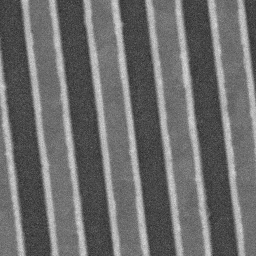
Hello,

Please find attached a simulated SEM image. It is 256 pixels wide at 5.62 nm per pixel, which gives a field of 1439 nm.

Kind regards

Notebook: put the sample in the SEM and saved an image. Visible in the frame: parallel lines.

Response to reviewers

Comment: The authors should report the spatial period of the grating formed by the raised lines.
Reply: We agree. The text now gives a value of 348 nm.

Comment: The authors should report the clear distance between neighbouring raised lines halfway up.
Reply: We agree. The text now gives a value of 186 nanometres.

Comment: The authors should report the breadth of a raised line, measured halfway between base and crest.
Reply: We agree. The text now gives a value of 161 nanometers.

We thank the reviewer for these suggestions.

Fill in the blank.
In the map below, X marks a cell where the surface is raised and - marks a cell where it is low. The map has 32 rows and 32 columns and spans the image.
---XXXX----XXX-----XXX----XXXX--
---XXXX----XXXX----XXX----XXXX--
---XXXX----XXXX----XXXX----XXX--
---XXXX----XXXX----XXXX----XXXX-
----XXX----XXXX----XXXX----XXXX-
----XXX----XXXX----XXXX----XXXX-
----XXX-----XXX----XXXX----XXXX-
----XXXX----XXX-----XXX----XXXX-
----XXXX----XXX-----XXX----XXXX-
----XXXX----XXXX----XXX----XXXX-
----XXXX----XXXX----XXX-----XXX-
----XXXX----XXXX----XXXX----XXXX
-----XXX----XXXX----XXXX----XXXX
X----XXX----XXXX----XXXX----XXXX
X----XXX-----XXX----XXXX----XXXX
X----XXXX----XXX----XXXX----XXXX
X----XXXX----XXX-----XXX----XXXX
X----XXXX----XXXX----XXX----XXXX
X----XXXX----XXXX----XXX-----XXX
X----XXXX----XXXX----XXXX----XXX
X-----XXX----XXXX----XXXX----XXX
XX----XXX----XXXX----XXXX----XXX
XX----XXX----XXXX----XXXX----XXX
XX----XXX-----XXX----XXXX----XXX
XX----XXXX----XXX-----XXX----XXX
XX----XXXX----XXXX----XXX----XXX
XX----XXXX----XXXX----XXX-----XX
XX----XXXX----XXXX----XXXX----XX
XX----XXXX----XXXX----XXXX----XX
XX-----XXX----XXXX----XXXX----XX
XXX----XXX----XXXX----XXXX----XX
XXX----XXXX----XXX----XXXX----XX